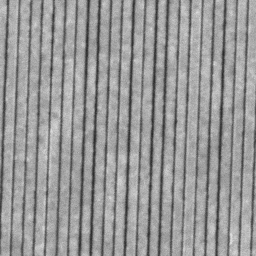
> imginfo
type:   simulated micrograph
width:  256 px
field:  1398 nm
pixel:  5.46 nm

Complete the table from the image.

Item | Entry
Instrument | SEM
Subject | parallel lines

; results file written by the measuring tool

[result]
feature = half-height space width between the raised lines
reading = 15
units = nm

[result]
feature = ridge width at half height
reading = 0.0505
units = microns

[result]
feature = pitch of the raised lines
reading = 0.0625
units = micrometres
